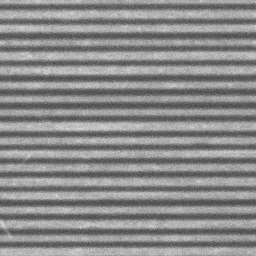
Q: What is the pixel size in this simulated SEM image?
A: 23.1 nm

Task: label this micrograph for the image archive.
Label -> parallel lines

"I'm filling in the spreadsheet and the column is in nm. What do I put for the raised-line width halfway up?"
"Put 222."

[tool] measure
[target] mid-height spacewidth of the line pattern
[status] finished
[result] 3.88 pixels